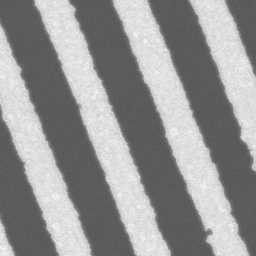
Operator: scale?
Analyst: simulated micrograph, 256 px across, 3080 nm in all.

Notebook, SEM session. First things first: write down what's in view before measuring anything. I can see one or a few lines or trenches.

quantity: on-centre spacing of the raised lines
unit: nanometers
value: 870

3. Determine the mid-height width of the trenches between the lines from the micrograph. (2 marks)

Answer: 356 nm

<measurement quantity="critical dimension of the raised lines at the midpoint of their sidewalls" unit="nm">513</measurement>